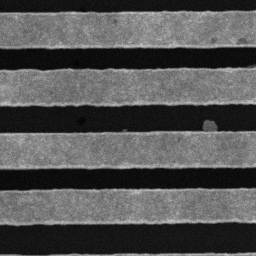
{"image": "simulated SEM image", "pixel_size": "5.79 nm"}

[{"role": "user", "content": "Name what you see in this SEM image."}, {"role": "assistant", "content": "lines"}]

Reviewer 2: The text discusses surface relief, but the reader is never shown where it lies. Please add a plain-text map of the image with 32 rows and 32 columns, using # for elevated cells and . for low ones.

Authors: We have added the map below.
................................
....................#.##..#.####
################################
################################
################################
################################
................................
................................
............................##.#
################################
################################
################################
################################
................................
................................
................................
...................#############
################################
################################
################################
################################
................................
................................
................................
################################
################################
################################
################################
................................
................................
................................
................................